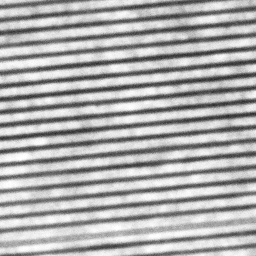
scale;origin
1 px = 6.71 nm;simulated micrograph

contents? parallel lines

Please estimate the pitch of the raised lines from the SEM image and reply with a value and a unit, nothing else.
88.2 nm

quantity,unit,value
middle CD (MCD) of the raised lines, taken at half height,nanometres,52.6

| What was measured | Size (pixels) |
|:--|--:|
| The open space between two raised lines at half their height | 5.23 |